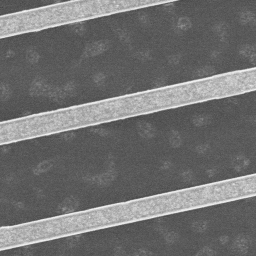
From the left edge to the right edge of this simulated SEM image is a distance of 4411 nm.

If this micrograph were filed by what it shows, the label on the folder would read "one or a few lines or trenches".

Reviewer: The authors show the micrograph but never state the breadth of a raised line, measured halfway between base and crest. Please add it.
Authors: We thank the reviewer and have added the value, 366 nm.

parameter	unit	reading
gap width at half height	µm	1.42